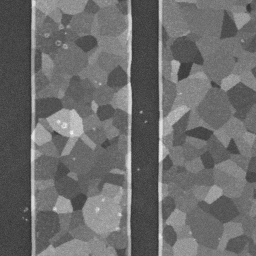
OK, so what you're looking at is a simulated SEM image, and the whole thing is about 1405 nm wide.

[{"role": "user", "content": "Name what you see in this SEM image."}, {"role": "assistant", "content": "one or a few lines or trenches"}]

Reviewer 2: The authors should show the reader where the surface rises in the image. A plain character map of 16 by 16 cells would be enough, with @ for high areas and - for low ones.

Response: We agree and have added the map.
--@@@@@@--@@@@@@
--@@@@@@--@@@@@@
--@@@@@@--@@@@@@
--@@@@@@--@@@@@@
--@@@@@@--@@@@@@
--@@@@@@--@@@@@@
--@@@@@@--@@@@@@
--@@@@@@--@@@@@@
--@@@@@@--@@@@@@
--@@@@@@--@@@@@@
--@@@@@@--@@@@@@
--@@@@@@--@@@@@@
--@@@@@@--@@@@@@
--@@@@@@--@@@@@@
--@@@@@@--@@@@@@
--@@@@@@--@@@@@@